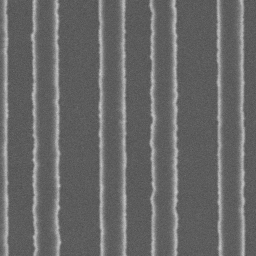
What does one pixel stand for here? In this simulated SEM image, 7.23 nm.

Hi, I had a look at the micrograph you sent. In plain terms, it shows lines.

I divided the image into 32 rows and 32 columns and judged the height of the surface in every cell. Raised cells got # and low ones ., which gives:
#...###.....###....###.....###..
#...###.....###....###.....###..
#...###.....###....###.....###..
#...###.....###....###.....###..
#...###.....####...###.....###..
#...###.....###....###.....###..
#...###.....####...###.....###..
#...###......##....###.....###..
#...###.....####...###.....###..
#...###.....####...###.....###..
#...###.....####...###.....###..
#...###......###...###.....###..
#...###.....####...###.....###..
#...###.....####...###.....###..
#...###.....####...###.....###..
#...###.....####...###.....###..
#...###.....####...###.....###..
#...###.....####...###.....###..
#...###.....####...###.....###..
#...###......###...###.....###..
#...###......###...###.....###..
#...###......###...###.....###..
#...###......###...###.....###..
#...###......###...###.....###..
#...###......###...###.....###..
#...###......###...###.....###..
#...###......###...###.....###..
#...###......###...###.....###..
#...###......###...###.....###..
#...###......###...###.....###..
#...###......###...###.....###..
#...###......###...###.....###..